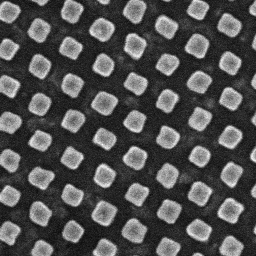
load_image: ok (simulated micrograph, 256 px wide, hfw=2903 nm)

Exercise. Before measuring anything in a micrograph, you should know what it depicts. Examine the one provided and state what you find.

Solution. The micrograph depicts a regular array of raised bodies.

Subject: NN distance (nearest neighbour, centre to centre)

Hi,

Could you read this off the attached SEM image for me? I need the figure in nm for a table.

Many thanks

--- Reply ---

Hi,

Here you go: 401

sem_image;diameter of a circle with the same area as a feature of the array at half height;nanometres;239